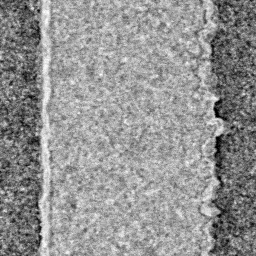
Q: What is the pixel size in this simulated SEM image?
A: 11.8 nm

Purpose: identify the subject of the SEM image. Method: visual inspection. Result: one or a few lines or trenches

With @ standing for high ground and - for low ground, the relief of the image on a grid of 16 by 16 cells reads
---@@@@@@@@@@---
---@@@@@@@@@@---
---@@@@@@@@@@---
---@@@@@@@@@@---
---@@@@@@@@@@---
---@@@@@@@@@@---
---@@@@@@@@@@---
---@@@@@@@@@@@--
---@@@@@@@@@@---
---@@@@@@@@@@---
---@@@@@@@@@@---
---@@@@@@@@@@---
---@@@@@@@@@@---
---@@@@@@@@@@---
---@@@@@@@@@@---
---@@@@@@@@@@---